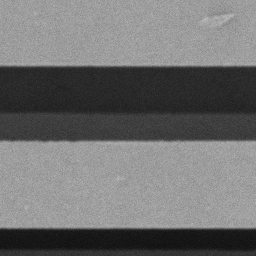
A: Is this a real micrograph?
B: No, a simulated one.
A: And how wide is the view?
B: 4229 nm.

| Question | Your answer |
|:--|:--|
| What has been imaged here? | lines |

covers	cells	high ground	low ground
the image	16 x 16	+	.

++++++++++++++++
++++++++++++++++
++++++++++++++++
++++++++++++++++
................
................
................
................
................
++++++++++++++++
++++++++++++++++
++++++++++++++++
++++++++++++++++
++++++++++++++++
................
................